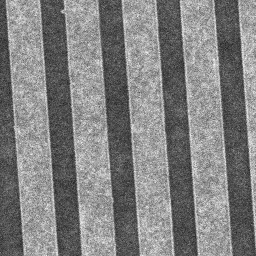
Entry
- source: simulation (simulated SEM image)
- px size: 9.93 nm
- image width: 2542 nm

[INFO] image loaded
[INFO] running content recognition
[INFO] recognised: parallel lines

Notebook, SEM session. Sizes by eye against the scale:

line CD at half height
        0.327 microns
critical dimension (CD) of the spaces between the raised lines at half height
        250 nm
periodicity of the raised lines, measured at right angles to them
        58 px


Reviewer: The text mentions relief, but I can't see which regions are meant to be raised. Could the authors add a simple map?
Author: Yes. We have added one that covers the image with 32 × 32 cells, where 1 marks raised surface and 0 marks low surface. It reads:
01111000111100011110000111100011
01111000111100011111000111100011
01111000111100001111000111100011
01111000111100001111000111100011
01111000111100001111000111100011
01111000011110001111000111100011
01111000011110001111000111100011
01111000011110001111000111100011
01111000011110001111000111100001
00111100011110001111000111100001
00111100011110001111000111100001
00111100011110001111000111110001
00111100011110001111000011110001
00111100011110001111000011110001
00111100011110001111000011110001
00111100011110001111100011110001
00111100011110000111100011110001
00111100011110000111100011110001
00111100011110000111100011110001
00111100001111000111100011110001
00111100001111000111100011110001
00111100001111000111100011110001
00111100001111000111100011110000
00011110001111000111100011110000
00011110001111000111100011110000
00011110001111000111100011111000
00011110001111000111100001111000
00011110001111000111100001111000
00011110001111000111100001111000
00011110001111000111110001111000
00011110001111000011110001111000
00011110001111000011110001111000